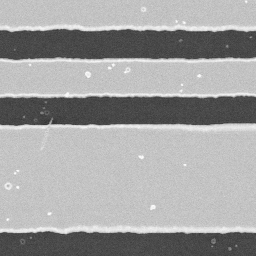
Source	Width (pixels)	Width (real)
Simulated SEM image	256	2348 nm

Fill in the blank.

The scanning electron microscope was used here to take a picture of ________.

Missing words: lines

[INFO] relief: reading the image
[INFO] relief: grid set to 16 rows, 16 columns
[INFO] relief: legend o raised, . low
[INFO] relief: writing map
oooooooooooooooo
oooooooooooooooo
................
................
oooooooooooooooo
oooooooooooooooo
................
................
oooooooooooooooo
oooooooooooooooo
oooooooooooooooo
oooooooooooooooo
oooooooooooooooo
oooooooooooooooo
oo.oo.oooooooooo
................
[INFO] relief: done